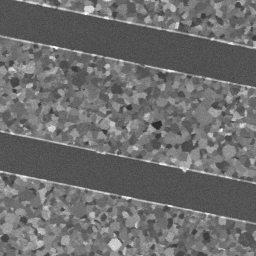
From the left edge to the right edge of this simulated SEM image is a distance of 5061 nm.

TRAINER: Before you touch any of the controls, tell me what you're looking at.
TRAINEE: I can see one or a few lines or trenches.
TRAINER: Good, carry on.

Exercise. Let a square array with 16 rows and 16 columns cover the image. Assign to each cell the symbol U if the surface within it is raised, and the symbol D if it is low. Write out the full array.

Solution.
DDDUUUUUUUUUUUUU
DDDDDDDDUUUUUUUU
UDDDDDDDDDDDDDUU
UUUUUUDDDDDDDDDD
UUUUUUUUUUUDDDDD
UUUUUUUUUUUUUUUU
UUUUUUUUUUUUUUUU
UUUUUUUUUUUUUUUU
DUUUUUUUUUUUUUUU
DDDDDDUUUUUUUUUU
DDDDDDDDDDDUUUUU
UUUUDDDDDDDDDDDD
UUUUUUUUUDDDDDDD
UUUUUUUUUUUUUUDD
UUUUUUUUUUUUUUUU
UUUUUUUUUUUUUUUU